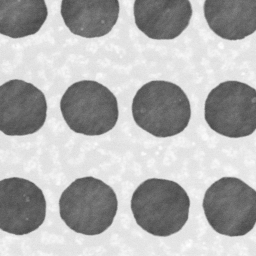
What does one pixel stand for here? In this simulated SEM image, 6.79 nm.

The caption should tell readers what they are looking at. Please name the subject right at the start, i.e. holes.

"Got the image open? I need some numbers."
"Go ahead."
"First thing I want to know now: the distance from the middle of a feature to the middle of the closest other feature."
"0.488 um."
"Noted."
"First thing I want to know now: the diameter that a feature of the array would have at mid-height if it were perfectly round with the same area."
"396 nm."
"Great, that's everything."